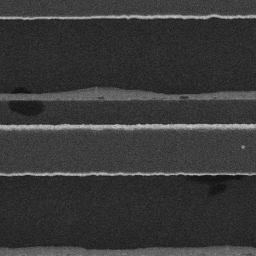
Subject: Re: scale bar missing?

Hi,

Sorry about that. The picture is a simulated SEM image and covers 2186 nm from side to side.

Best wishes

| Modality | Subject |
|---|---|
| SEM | lines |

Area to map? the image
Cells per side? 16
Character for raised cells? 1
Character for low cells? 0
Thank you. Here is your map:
1111111111111111
0000000000000000
0000000000000000
0000000000000000
0000000000000000
0000000000000000
0000000000000000
0000000000000000
1111111111111111
1111111111111111
1111111111111111
0000000000000000
0000000000000000
0000000000000000
0000000000000000
0000000000000000